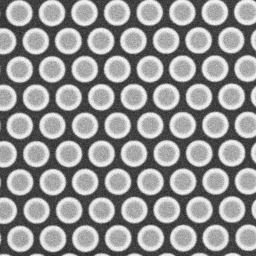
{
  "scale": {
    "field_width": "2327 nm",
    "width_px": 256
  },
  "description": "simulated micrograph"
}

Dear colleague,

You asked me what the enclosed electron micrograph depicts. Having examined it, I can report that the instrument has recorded an array of small figures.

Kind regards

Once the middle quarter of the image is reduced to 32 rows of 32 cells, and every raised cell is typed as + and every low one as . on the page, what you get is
..++++++..++++++..+++++++.++++++
..++++++..++++++..+++++++.++++++
..++++++..++++++...++++++..+++++
...+++++...+++++...+++++...+++++
................................
++......+++.....+++.....+++.....
++++...+++++...+++++...+++++...+
++++..++++++..+++++++.+++++++..+
++++..++++++..+++++++.+++++++..+
++++..++++++..++++++...++++++..+
++++...+++++...+++++...+++++...+
++..............................
....++......+++.....+++.....+++.
...+++++...+++++...+++++...+++++
..++++++..++++++..+++++++.++++++
..++++++..+++++++.+++++++.++++++
..++++++..++++++...++++++..+++++
...+++++...+++++...+++++...+++++
....++......++..................
++......+++.....+++.....+++.....
++++...+++++...+++++...+++++...+
++++..++++++..+++++++..++++++..+
++++..++++++..+++++++..++++++..+
++++..++++++..+++++++..++++++..+
++++...+++++...+++++...+++++...+
++.......+.......+..............
....+++.....+++.....+++.....+++.
...+++++...+++++...+++++...+++++
..++++++..+++++++..++++++..+++++
..++++++..+++++++.+++++++..+++++
..++++++..++++++...++++++..+++++
...+++++...+++++...+++++...+++++